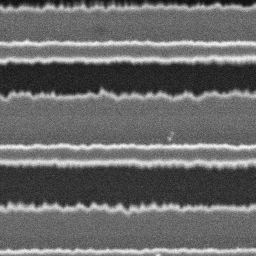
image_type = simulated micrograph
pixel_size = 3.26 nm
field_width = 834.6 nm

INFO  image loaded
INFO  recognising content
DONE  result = lines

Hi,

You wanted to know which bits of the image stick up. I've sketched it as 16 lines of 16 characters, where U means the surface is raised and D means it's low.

DDDUDUUUUUUUUUUU
UUUUUUUUUUUUUUUU
UUUUUUUUUUUUUUUU
UUUUUUUUUUUUUUUU
DDDDDDDDDDDDDDDD
DDDDDDDDDDDDDDDD
UUUUUUUUUUUUUUUU
UUUUUUUUUUUUUUUU
UUUUUUUUUUUUUUUU
UUUUUUUUUUUUUUUU
DDDDDDDDDDDDDDDD
DDDDDDDDDDDDDDDD
DDDDDDDDDDDDDDDD
UUUUUUUUUUUUUUUU
UUUUUUUUUUUUUUUU
UUUUUUUUUUUUUUUU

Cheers